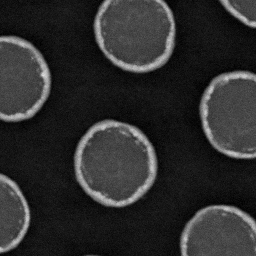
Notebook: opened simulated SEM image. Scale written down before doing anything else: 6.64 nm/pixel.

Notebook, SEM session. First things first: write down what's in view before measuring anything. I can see raised bodies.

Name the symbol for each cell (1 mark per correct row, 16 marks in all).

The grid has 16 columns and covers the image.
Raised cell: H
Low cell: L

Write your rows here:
LLLLLLHHHHHLLLHH
LLLLLLHHHHHLLLLL
HLLLLLHHHHHLLLLL
HHLLLLLHHHLLLLLL
HHHLLLLLLLLLLLLL
HHHLLLLLLLLLLHHH
HHHLLLLLLLLLLHHH
LLLLLLLLLLLLLHHH
LLLLLHHHHLLLLHHH
LLLLLHHHHHLLLLHH
LLLLLHHHHHLLLLLL
HLLLLHHHHLLLLLLL
HHLLLLHHLLLLLLLL
HHLLLLLLLLLLHHHL
HHLLLLLLLLLLHHHH
HLLLLLLLLLLHHHHH